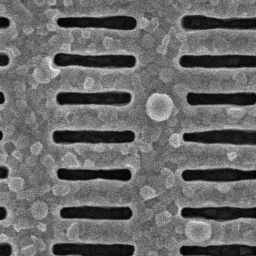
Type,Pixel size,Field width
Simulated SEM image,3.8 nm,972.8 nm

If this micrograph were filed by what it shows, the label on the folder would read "holes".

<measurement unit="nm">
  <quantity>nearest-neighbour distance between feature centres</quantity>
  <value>143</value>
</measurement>